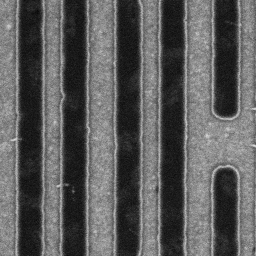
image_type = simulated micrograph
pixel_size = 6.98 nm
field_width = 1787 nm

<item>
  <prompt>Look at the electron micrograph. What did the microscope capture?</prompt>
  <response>parallel lines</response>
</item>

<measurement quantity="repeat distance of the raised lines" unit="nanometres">340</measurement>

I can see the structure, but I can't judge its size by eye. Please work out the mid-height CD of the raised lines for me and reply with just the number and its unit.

0.189 um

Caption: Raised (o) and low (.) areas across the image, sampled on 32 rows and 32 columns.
..ooo...ooo...oooo..ooo....ooo..
..ooo...ooo...oooo..ooo....ooo..
..ooo...ooo...oooo..ooo....ooo..
..ooo...ooo...oooo..ooo....ooo..
..ooo...ooo...oooo..ooo....ooo..
..ooo...ooo...oooo..ooo....ooo..
..ooo...ooo...oooo..ooo....ooo..
..ooo...ooo...oooo..ooo....ooo..
..ooo...ooo...oooo..ooo....ooo..
..ooo...ooo...oooo..ooo....ooo..
..ooo...ooo...oooo..ooo....ooo..
..ooo...ooo...oooo..ooo....ooo..
..ooo...ooo...oooo..ooo....ooo..
..ooo...ooo...oooo..ooo...oooo..
..ooo...ooo...oooo..ooo....ooo..
..ooo...ooo...oooo..ooo.........
..ooo...ooo...oooo..ooo.........
..oooo..ooo...oooo..ooo.........
..oooo..ooo...oooo..ooo.........
..ooo...ooo...oooo..ooo.........
..ooo...ooo...oooo..ooo.........
..ooo...ooo...oooo..ooo....ooo..
..ooo...ooo...oooo..ooo....ooo..
..oooo.oooo...oooo..ooo...oooo..
..ooo...ooo...oooo..ooo...oooo..
..ooo...ooo...oooo..ooo....ooo..
..ooo...ooo...oooo..ooo...oooo..
..ooo...ooo...oooo..ooo...oooo..
..ooo...ooo...oooo..ooo...oooo..
..ooo...ooo...oooo..ooo....ooo..
..oooo..ooo...oooo..ooo...oooo..
..ooo...ooo...oooo..ooo....ooo..